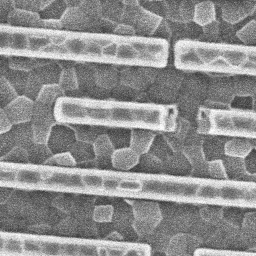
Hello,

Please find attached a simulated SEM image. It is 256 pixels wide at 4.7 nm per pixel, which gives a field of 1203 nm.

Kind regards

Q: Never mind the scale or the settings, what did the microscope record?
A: one or a few lines or trenches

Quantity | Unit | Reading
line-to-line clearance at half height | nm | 230